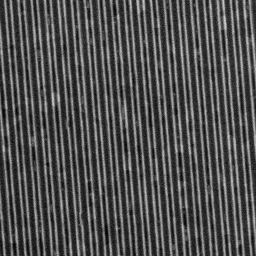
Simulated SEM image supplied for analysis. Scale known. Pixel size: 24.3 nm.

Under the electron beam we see parallel lines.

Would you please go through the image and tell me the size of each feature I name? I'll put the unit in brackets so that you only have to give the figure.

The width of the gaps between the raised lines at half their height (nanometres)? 194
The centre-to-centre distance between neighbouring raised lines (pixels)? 13.2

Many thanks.